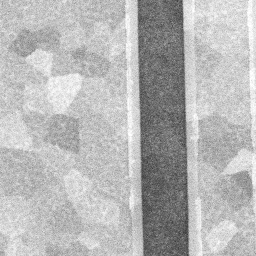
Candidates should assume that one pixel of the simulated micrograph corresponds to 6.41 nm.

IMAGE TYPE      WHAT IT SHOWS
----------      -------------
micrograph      one or a few lines or trenches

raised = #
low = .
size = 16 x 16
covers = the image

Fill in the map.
########....####
########....####
########....####
########....####
########....####
########....####
########....####
########....####
########....####
########....####
########....####
########....####
########....####
#########...####
#########...####
#########...####